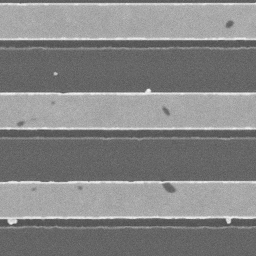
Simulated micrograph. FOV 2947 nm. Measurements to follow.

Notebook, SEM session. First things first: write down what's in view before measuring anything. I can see lines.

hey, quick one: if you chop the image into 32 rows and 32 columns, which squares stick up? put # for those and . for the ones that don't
################################
################################
################################
################################
################################
................................
................................
................................
................................
................................
................................
................................
################################
################################
################################
################################
................................
................................
................................
................................
................................
................................
................................
################################
################################
################################
################################
................................
................................
................................
................................
................................